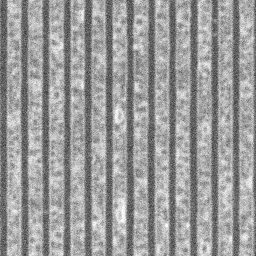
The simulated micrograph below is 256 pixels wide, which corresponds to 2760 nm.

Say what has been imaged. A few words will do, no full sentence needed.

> parallel lines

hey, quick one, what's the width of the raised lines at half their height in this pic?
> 0.14 um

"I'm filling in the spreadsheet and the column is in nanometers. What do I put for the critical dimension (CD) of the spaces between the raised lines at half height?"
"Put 90.3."